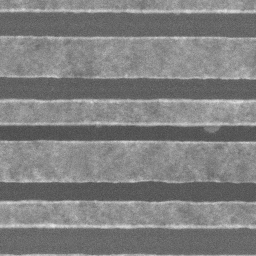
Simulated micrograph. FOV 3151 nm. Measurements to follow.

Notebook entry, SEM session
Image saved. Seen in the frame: lines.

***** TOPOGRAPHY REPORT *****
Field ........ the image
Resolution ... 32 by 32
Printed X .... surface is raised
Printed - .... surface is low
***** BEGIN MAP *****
XXXXXXXXXXXXXXXXXXXXXXXXXXXXXXXX
-----------------X--XX--X---XXXX
--------------------------------
--------------------------------
--------------------------------
XXXXXXXXXXXXXXXXXXXXXXXXXXXXXXXX
XXXXXXXXXXXXXXXXXXXXXXXXXXXXXXXX
XXXXXXXXXXXXXXXXXXXXXXXXXXXXXXXX
XXXXXXXXXXXXXXXXXXXXXXXXXXXXXXXX
XXXXXXXXXXXXXXXXXXXXXXXXXXXXXXXX
--------------------------------
--------------------------------
XX-------X---------XX-----------
XXXXXXXXXXXXXXXXXXXXXXXXXXXXXXXX
XXXXXXXXXXXXXXXXXXXXXXXXXXXXXXXX
XXXXXXXXXXXXXXXXXXXXXXXXXXXXXXXX
--------------------------------
--------------------------------
XXXXXXXXXXXXXXXXXXXXXXXXXXXXXXXX
XXXXXXXXXXXXXXXXXXXXXXXXXXXXXXXX
XXXXXXXXXXXXXXXXXXXXXXXXXXXXXXXX
XXXXXXXXXXXXXXXXXXXXXXXXXXXXXXXX
XXXXXXXXXXXXXXXXXXXXXXXXXXXXXXXX
--------------------------------
--------------------------------
XXXXXXXXXXXXXXXXXXXXXXXXXXXXXXXX
XXXXXXXXXXXXXXXXXXXXXXXXXXXXXXXX
XXXXXXXXXXXXXXXXXXXXXXXXXXXXXXXX
-------------------------XXX----
--------------------------------
--------------------------------
--------------------------------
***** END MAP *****